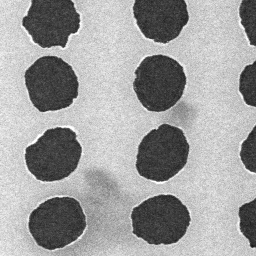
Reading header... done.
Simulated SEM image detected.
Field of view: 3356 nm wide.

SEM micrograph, holes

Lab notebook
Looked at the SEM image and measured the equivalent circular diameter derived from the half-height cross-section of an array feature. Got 722 nm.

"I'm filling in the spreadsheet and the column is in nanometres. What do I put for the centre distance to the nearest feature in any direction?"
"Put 892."